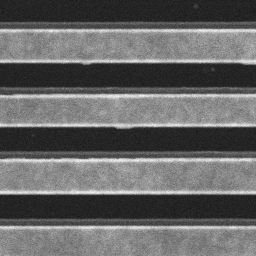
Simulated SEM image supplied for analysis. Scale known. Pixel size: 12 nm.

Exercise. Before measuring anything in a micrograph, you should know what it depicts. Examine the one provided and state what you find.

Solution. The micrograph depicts lines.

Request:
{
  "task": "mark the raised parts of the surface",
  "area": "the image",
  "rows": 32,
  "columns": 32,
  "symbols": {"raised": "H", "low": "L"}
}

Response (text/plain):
LLLLLLLLLLLLLLLLLLLLLLLLLLLLLLLL
LLLLLLLLLLLLLLLLLLLLLLLLLLLLLLLL
LLLLLLLLLLLLLLLLLLLLLLLLLLLLLLLL
HHHHHHHHHHHHHHHHHHHHHHHHHHHHHHHH
HHHHHHHHHHHHHHHHHHHHHHHHHHHHHHHH
HHHHHHHHHHHHHHHHHHHHHHHHHHHHHHHH
HHHHHHHHHHHHHHHHHHHHHHHHHHHHHHHH
HHHHHHHHHHHHHHHHHHHHHHHHHHHHHHHH
LLLLLLLLLLLLLLLLLLLLLLLLLLLLLLLL
LLLLLLLLLLLLLLLLLLLLLLLLLLLLLLLL
LLLLLLLLLLLLLLLLLLLLLLLLLLLLLLLL
HHHHHHHHHHHHHHHHHHHHHHHHHHHHHHHH
HHHHHHHHHHHHHHHHHHHHHHHHHHHHHHHH
HHHHHHHHHHHHHHHHHHHHHHHHHHHHHHHH
HHHHHHHHHHHHHHHHHHHHHHHHHHHHHHHH
HHHHHHHHHHHHHHHHHHHHHHHHHHHHHHHH
LLLLLLLLLLLLLLLLLLLLLLLLLLLLLLLL
LLLLLLLLLLLLLLLLLLLLLLLLLLLLLLLL
LLLLLLLLLLLLLLLLLLLLLLLLLLLLLLLL
HHHHHHHHHHHHHHHHHHHHHHHHHHHHHHHH
HHHHHHHHHHHHHHHHHHHHHHHHHHHHHHHH
HHHHHHHHHHHHHHHHHHHHHHHHHHHHHHHH
HHHHHHHHHHHHHHHHHHHHHHHHHHHHHHHH
HHHHHHHHHHHHHHHHHHHHHHHHHHHHHHHH
LLLLLLLLLLLLLLLLLLLLLLLLLLLLLLLL
LLLLLLLLLLLLLLLLLLLLLLLLLLLLLLLL
LLLLLLLLLLLLLLLLLLLLLLLLLLLLLLLL
HHHHHHHHHHHHHHHHHHHHHHHHHHHHHHHH
HHHHHHHHHHHHHHHHHHHHHHHHHHHHHHHH
HHHHHHHHHHHHHHHHHHHHHHHHHHHHHHHH
HHHHHHHHHHHHHHHHHHHHHHHHHHHHHHHH
HHHHHHHHHHHHHHHHHHHHHHHHHHHHHHHH